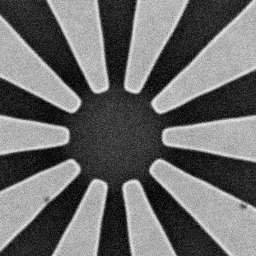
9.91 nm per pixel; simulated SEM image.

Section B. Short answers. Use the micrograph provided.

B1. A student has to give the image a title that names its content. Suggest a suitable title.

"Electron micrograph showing groups of lines, slits or small figures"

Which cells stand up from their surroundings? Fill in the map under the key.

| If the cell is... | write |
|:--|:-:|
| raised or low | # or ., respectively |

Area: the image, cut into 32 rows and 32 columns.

......######.....######........#
.......#####.....######.......##
#......#####.....#####.......###
#.......#####....#####......####
##......#####....####......#####
###......####...#####.....######
####.....####...####.....#######
#####.....###...####....########
######....###...###....#########
#######....##...###...########..
..######...##...##...#######....
....#####...#...#...######......
......####.........#####........
........##.........###..........
................................
######...................#######
########.............###########
########............############
#####..................#########
............................####
........##.........##...........
.....#####.........####.........
...######...........#####.......
.#######...##..###...######.....
#######....##...##....#######...
######....###...###....########.
#####.....###...###.....########
####.....####...####.....#######
###.....#####...####.....#######
##......####....#####.....######
#......#####....#####......#####
.......#####....######......####